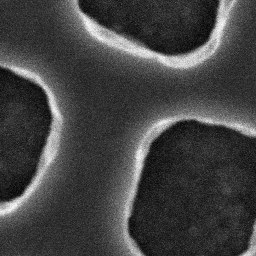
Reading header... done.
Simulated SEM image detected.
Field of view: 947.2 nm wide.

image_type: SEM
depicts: holes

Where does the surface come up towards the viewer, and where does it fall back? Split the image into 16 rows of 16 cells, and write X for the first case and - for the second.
XXXXX---------XX
XXXXXX--------XX
XXXXXXXX-----XXX
XXXXXXXXXX--XXXX
-XXXXXXXXXXXXXXX
---XXXXXXXXXXXXX
---XXXXXXXXXXXXX
---XXXXXXXX-XXXX
---XXXXXXX------
---XXXXXX-------
---XXXXXX-------
--XXXXXX--------
-XXXXXXX--------
XXXXXXXX--------
XXXXXXXX--------
XXXXXXXX--------